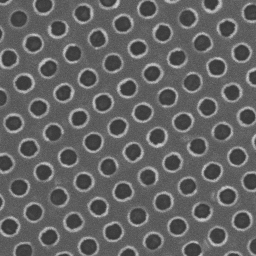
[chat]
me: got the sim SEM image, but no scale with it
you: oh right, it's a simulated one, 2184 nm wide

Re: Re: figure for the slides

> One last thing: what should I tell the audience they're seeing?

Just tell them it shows a regular array of holes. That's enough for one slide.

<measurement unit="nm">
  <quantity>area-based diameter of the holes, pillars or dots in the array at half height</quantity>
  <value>134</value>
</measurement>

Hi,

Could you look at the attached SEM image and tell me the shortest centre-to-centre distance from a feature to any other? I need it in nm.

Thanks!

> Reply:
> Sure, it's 243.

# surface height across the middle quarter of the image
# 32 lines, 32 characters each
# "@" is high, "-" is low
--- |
@@@@@@@@@@----@@@@@@@@@@@@@@@@@@
@@@@@@@@@@@--@@@@@@@----@@@@@@@@
@@@@@---@@@@@@@@@@@@----@@@@@@@@
@@@@----@@@@@@@@@@@@---@@@@@@@--
@@@@----@@@@@@@@-@@@@@@@@@@@@@--
-@@@@--@@@@@@@----@@@@@@@@@@@@--
--@@@@@@@@@@@@----@@@@@@@--@@@@-
--@@@@@@@@@@@@@--@@@@@@@----@@@@
-@@@@@@@---@@@@@@@@@@@@@----@@@@
@@@@@@@@----@@@@@@@@@@@@----@@@@
@@@@@@@@----@@@@@@@--@@@@@@@@@@@
@@@@@@@@---@@@@@@@----@@@@@@@@@@
@@---@@@@@@@@@@@@@----@@@@@@@@@@
@@----@@@@@@@@@@@@---@@@@@@@----
@@---@@@@@@@---@@@@@@@@@@@@-----
@@@@@@@@@@@----@@@@@@@@@@@@@---@
@@@@@@@@@@@----@@@@@@@---@@@@-@@
@@@@@@@-@@@@--@@@@@@@@---@@@@@@@
@@@@@----@@@@@@@@@@@@----@@@@@@@
@@@@@----@@@@@@@@@@@@@---@@@@@@@
@@@@@----@@@@@@@---@@@@@@@@@@@@@
--@@@@@-@@@@@@@----@@@@@@@@@@@@@
---@@@@@@@@@@@@----@@@@@@@@@@@@@
---@@@@@@@@@@@@@--@@@@@@@@---@@@
---@@@@@@@---@@@@@@@@@@@@----@@@
@@@@@@@@@----@@@@@@@@@@@@----@@@
@@@@@@@@@----@@@@@@@--@@@@--@@@@
@@@@@@@@@@--@@@@@@@----@@@@@@@@@
@@@----@@@@@@@@@@@@----@@@@@@@@@
@@@----@@@@@@@@@@@@@---@@@@@@---
@@@---@@@@@@@---@@@@@@@@@@@@@---
@@@@@@@@@@@@@----@@@@@@@@@@@@---